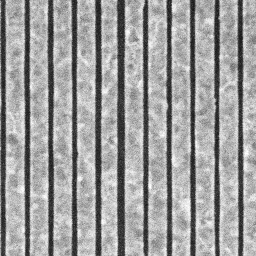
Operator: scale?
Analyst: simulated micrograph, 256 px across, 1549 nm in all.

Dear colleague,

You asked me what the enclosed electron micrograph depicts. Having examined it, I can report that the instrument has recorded parallel lines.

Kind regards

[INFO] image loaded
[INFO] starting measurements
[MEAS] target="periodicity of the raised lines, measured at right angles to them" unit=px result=23.7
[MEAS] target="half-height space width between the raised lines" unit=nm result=34.8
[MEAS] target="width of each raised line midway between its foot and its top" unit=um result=0.107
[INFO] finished